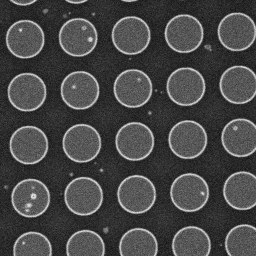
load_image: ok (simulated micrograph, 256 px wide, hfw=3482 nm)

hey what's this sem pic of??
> an array of small figures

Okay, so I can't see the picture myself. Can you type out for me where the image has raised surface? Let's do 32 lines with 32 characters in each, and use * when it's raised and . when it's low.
..**............................
................................
.........**....***...****...***.
.****...****..*****..****..*****
.****..*****..*****..****..*****
.****...****..****...****...***.
.****...***....***....*.........
................................
.............................**.
..***...****...***...****...****
.*****..****..*****..*****.*****
.*****..****..*****..*****..****
.*****..****...****...***....**.
..***....**.....................
................................
................**....***...****
..***...****...****..*****..****
.*****..*****.*****..*****..****
.*****..*****..****..*****..****
..****..****...***....***....**.
................................
..............................*.
...**....***....***...***...****
..****..*****..****..*****..****
..****..*****..****..*****..****
..****..*****..****...****...***
..***....***....**..............
................................
.......................**....***
...**....***...****...****..****
..****..*****..*****..****..****
..****..*****..*****..****..****